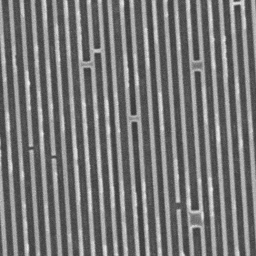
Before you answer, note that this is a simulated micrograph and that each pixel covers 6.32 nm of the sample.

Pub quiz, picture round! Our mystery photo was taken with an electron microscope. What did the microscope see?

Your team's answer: parallel lines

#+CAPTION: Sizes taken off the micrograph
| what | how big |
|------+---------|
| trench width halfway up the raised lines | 48.1 nm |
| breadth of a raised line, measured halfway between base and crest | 21.3 nm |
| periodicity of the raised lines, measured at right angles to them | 69.7 nanometers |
